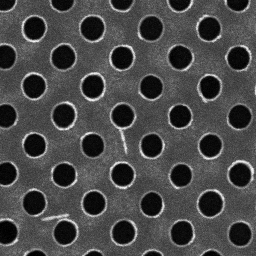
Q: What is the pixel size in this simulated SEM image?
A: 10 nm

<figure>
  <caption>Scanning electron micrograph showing a regular array of holes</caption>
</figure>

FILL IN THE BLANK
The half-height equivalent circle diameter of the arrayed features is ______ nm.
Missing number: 234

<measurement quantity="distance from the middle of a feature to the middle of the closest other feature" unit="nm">410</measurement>